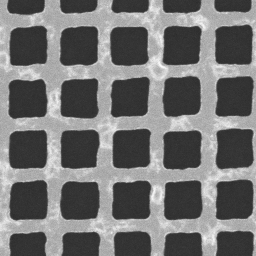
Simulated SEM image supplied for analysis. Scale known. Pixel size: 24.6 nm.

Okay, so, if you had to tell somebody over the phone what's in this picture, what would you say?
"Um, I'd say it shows a regular array of holes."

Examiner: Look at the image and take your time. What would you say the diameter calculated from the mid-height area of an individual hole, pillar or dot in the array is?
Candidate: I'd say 1040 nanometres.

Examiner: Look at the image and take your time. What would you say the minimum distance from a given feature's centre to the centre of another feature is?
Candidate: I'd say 1250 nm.